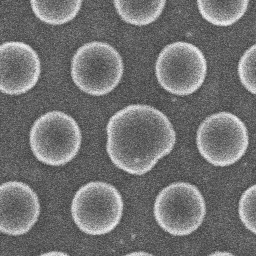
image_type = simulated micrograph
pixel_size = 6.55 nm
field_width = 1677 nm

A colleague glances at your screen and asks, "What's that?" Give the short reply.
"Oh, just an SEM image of raised bodies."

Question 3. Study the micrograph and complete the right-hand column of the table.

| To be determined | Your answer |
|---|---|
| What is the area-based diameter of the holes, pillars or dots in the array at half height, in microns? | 0.319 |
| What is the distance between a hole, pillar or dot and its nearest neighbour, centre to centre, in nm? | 534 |